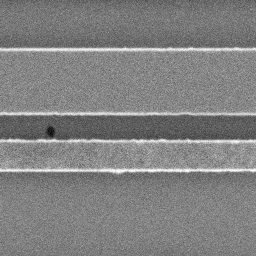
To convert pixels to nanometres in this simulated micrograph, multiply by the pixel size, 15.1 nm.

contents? lines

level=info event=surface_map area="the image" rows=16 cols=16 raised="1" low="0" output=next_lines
0000000000000000
0000000000000000
0000000000000000
1111111111111111
1111111111111111
1111111111111111
1111111111111111
0000000000000000
0000000000000000
1111111111111111
1111111111111111
0000000000000000
0000000000000000
0000000000000000
0000000000000000
0000000000000000